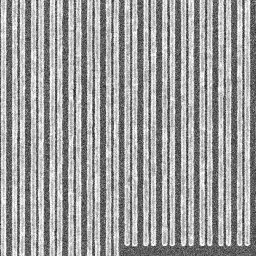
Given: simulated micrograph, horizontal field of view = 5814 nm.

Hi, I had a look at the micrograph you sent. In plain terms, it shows parallel lines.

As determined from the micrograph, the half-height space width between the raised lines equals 142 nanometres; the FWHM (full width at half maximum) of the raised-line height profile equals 93.7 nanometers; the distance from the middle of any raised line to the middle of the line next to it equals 0.213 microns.